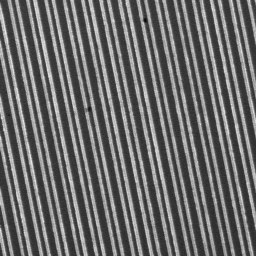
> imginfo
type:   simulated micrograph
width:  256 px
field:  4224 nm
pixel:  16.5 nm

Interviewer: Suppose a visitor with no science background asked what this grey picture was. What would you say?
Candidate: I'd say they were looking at parallel lines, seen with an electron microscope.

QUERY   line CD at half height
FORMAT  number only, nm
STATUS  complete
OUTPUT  54.6